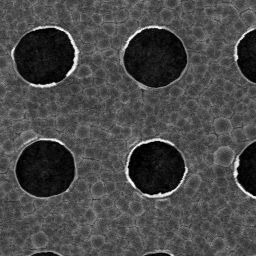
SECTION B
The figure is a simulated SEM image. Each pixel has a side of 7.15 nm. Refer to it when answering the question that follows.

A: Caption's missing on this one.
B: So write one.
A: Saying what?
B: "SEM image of holes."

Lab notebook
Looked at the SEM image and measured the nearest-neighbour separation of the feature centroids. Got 789 nanometers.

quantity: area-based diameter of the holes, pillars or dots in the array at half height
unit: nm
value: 422